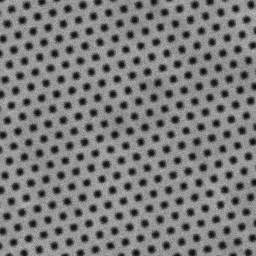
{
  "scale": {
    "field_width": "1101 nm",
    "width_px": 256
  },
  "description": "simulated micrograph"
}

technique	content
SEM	a regular array of holes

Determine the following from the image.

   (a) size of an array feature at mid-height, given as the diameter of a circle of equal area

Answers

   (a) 36 nanometres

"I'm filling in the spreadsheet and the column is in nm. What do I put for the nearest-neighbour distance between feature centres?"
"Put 65.5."